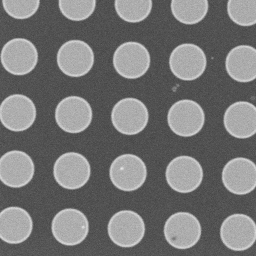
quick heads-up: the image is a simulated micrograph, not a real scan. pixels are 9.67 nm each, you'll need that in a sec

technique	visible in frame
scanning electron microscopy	an array of small figures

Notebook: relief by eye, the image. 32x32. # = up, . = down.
#####..#####..#####..#####...###
.###....####...####...####..####
.........#......##....###....###
................................
................................
.###....###....##...............
#####..#####..####....###....###
#####..#####..#####..#####..####
.###....###...#####..#####..####
.........#.....###....###....###
................................
................................
.###....###....##...............
####...####...####...####....###
####...####...#####..#####..####
####...####...####...####...####
........##.....##.....###....###
................................
................................
####....##.....##...............
####...####...####...####...####
####...####...####...####...####
####...####...####...####...####
........##.....##.....###...####
................................
................................
###.....##.....##...............
####...####...####...####...###.
####...####...####...####...####
####...####...####...####...####
........##.....##....###....####
................................